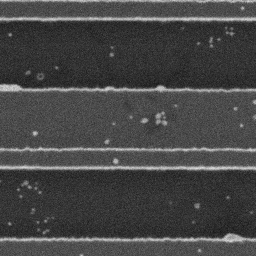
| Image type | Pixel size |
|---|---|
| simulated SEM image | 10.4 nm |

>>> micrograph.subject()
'lines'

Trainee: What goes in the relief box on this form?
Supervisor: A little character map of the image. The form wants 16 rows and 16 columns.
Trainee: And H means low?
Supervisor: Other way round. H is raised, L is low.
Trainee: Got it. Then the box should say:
HHHHHHHHHHHHHHHH
LLLLLLLLLLLLLLLL
LLLLLLLLLLLLLLLL
LLLLLLLLLLLLLLLL
LLLLLLLLLLLLLLLL
HLLLLLLLLLLLLLLL
HHHHHHHHHHHHHHHH
HHHHHHHHHHHHHHHH
HHHHHHHHHHHHHHHH
HHHHHHHHHHHHHHHH
LLLLLLLLLHHHHHLH
LLLLLLLLLLLLLLLL
LLLLLLLLLLLLLLLL
LLLLLLLLLLLLLLLL
LLLLLLLLLLLLLLLL
HHHHHHHHHHHHHHHH